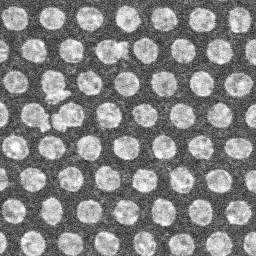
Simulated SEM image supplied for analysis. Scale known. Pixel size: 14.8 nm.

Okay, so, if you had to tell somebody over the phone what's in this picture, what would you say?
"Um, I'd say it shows a regular array of raised bodies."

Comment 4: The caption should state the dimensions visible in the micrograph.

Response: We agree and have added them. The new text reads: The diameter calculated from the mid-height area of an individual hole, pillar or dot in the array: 23.1 px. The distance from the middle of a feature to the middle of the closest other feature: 0.54 micrometres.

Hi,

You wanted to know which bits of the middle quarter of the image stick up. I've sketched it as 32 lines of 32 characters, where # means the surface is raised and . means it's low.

................................
................................
.....###......##.......####.....
....#####....#####....#####.....
....#####....#####....######....
....#####....#####....######....
....#####....#####.....#####....
#..............##.......###.....
................................
................................
###......####......##.......###.
####.....####.....####.....#####
#####....#####...######....#####
#####....#####....#####....#####
####.....#####.....####....#####
..........###...............###.
................................
................................
.....###......###.......##......
....#####....#####.....####.....
...######....#####....######...#
....#####....#####....######...#
....#####....#####.....####.....
.....###.......##...............
................................
................................
###......###................###.
####....#####.....#####....####.
####....######....#####....#####
#####...######...######....#####
####.....#####....#####....#####
.##................###......###.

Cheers